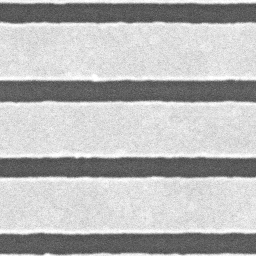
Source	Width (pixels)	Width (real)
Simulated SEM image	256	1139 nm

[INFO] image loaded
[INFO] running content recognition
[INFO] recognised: lines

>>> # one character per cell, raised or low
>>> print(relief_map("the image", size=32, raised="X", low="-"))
--------------------------------
--------------------------------
--------------------------------
XXXXXXXXXXXXXXXXXXXXXXXXXXXXXXXX
XXXXXXXXXXXXXXXXXXXXXXXXXXXXXXXX
XXXXXXXXXXXXXXXXXXXXXXXXXXXXXXXX
XXXXXXXXXXXXXXXXXXXXXXXXXXXXXXXX
XXXXXXXXXXXXXXXXXXXXXXXXXXXXXXXX
XXXXXXXXXXXXXXXXXXXXXXXXXXXXXXXX
XXXXXXXXXXXXXXXXXXXXXXXXXXXXXXXX
--------------------------------
--------------------------------
--------------------------------
XXXXXXXXXXXXXXXXXXXXXXXXXXXXXXXX
XXXXXXXXXXXXXXXXXXXXXXXXXXXXXXXX
XXXXXXXXXXXXXXXXXXXXXXXXXXXXXXXX
XXXXXXXXXXXXXXXXXXXXXXXXXXXXXXXX
XXXXXXXXXXXXXXXXXXXXXXXXXXXXXXXX
XXXXXXXXXXXXXXXXXXXXXXXXXXXXXXXX
XXXXXXXXXXXXXXXXXXXXXXXXXXXXXXXX
--------------------------------
--------------------------------
XXXXXXXXXXXXXXXXXXXXXXXXXXXXXXXX
XXXXXXXXXXXXXXXXXXXXXXXXXXXXXXXX
XXXXXXXXXXXXXXXXXXXXXXXXXXXXXXXX
XXXXXXXXXXXXXXXXXXXXXXXXXXXXXXXX
XXXXXXXXXXXXXXXXXXXXXXXXXXXXXXXX
XXXXXXXXXXXXXXXXXXXXXXXXXXXXXXXX
XXXXXXXXXXXXXXXXXXXXXXXXXXXXXXXX
--------------------------------
--------------------------------
--------------------------------